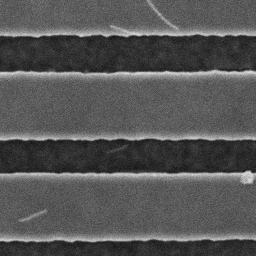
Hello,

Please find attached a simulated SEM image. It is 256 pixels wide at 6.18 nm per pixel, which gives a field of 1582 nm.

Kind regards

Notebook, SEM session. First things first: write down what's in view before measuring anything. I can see lines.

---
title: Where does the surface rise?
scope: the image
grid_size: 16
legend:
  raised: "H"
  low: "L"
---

HHHHHHHHHHHHHHHH
HHHHHHHHHHHHHHHH
LLLLLLLLLLLLLLLL
LLLLLLLLLLLLLLLL
LHLLLLLLLLHLHHHH
HHHHHHHHHHHHHHHH
HHHHHHHHHHHHHHHH
HHHHHHHHHHHHHHHH
HHHHHHHHHHHHHHHH
LLLLLLLLLLLLLLLL
LLLLLLLLLLLLLLLL
HHHHHHHHHHHHHHHH
HHHHHHHHHHHHHHHH
HHHHHHHHHHHHHHHH
HHHHHHHHHHHHHHHH
LLLLLLLLLLLLLLLL